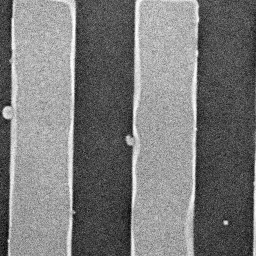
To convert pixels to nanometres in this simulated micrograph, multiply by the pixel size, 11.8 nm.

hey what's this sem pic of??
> wiring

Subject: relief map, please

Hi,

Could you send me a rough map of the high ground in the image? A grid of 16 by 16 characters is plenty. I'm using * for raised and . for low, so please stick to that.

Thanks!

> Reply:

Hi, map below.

.***.....***....
.****....***....
.****....***....
.****....***....
.***.....***....
.****....***....
.****...****....
.****...****....
.***....****....
.***....****....
.***....****....
.***....****....
.***....****....
.***....****....
.***....****....
.***....****....